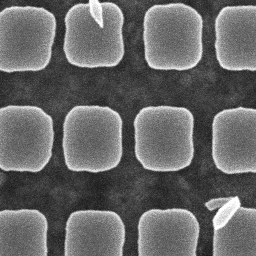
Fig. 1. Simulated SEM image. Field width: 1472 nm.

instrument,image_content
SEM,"raised bodies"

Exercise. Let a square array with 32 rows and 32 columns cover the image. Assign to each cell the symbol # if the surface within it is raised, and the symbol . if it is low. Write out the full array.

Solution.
...........###..................
######...######...#######...####
#######.#######...#######..#####
#######.#######...#######..#####
#######.#######...#######..#####
#######.#######...#######..#####
######..#######...#######..#####
######...######...#######..#####
#####..............#####....####
................................
................................
................................
................................
#####....#####.....###..........
######..#######..#######...#####
#######.#######..#######...#####
#######.#######..#######...#####
#######.#######..#######...#####
######..#######..#######...#####
######..#######..#######...#####
######..#######...######...#####
............................####
................................
................................
................................
..........................####..
#####....#####....######...#####
######...######..########..#####
######..########.########..#####
######..#######..########..#####
######..#######..########..#####
######..#######..#######...#####